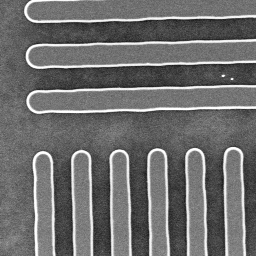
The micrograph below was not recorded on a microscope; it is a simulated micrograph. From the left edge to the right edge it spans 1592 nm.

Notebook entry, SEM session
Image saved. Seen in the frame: groups of lines, slits or small figures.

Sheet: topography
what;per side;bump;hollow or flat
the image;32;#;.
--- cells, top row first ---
....############################
...#############################
....##########..................
................................
................................
...........#####################
...#############################
...#############################
................................
................................
................................
....############################
...#############################
....########################....
................................
................................
................................
................................
................................
....##...##...##...##..##...##..
....##...##...##...##..##...##..
....##...##...##...##..##...##..
....##...##...##...##..##...##..
....###..##...##...##..###..##..
....###..##...##...##..###..##..
....###..##...##...##..###..##..
....###..##...##...##..###..##..
....###..##...##...##..###..##..
....###..##...##...##..###..###.
....###..##...##...##..###..###.
....###..##...##...##..###..###.
.....##..##...##...##...##..###.